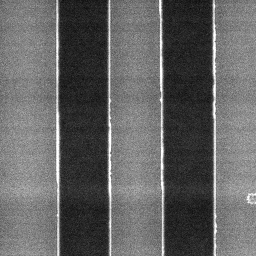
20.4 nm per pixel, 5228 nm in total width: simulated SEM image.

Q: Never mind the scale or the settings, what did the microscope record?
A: lines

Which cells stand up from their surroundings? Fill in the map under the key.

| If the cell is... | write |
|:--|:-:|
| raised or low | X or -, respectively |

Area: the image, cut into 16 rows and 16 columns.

----XXX---XXX---
----XXX---XXX---
----XXX---XXX---
----XXX---XXX---
----XXX---XXX---
----XXX---XXX---
----XXX---XXX---
----XXX---XXX---
----XXX---XXX---
----XXX---XXX---
----XXX---XXX---
----XXX---XXX---
----XXX---XXX---
----XXX---XXX---
----XXX---XXX---
----XXX---XXX---